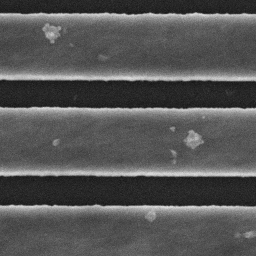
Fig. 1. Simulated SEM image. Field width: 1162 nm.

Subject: lines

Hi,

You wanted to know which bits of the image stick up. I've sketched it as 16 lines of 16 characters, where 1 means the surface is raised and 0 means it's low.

0000000000000000
1111111111111111
1111111111111111
1111111111111111
1111111111111111
0000000000000000
0000000000000000
1111111111111111
1111111111111111
1111111111111111
1111111111111111
0000000000000000
0000000000000000
1111111111111111
1111111111111111
1111111111111111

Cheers